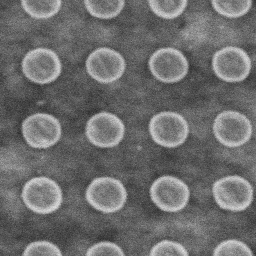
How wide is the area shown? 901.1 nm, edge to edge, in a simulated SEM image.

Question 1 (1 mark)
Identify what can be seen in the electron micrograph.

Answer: a regular array of raised bodies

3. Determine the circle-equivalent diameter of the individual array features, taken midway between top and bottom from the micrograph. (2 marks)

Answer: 127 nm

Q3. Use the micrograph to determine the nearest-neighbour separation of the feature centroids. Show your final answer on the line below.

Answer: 224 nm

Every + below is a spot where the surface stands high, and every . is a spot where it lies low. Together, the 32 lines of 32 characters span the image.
...++++....++++....++++....++++.
...++++....++++....++++....++++.
................................
................................
................................
................................
....++......++......++.....+++..
...++++....++++....++++....++++.
...++++....++++....++++....++++.
...++++....++++....++++....++++.
................................
................................
................................
................................
....++......++......++.....++++.
...++++....++++....++++....++++.
...+++++...++++....++++....++++.
...++++....++++....++++....++++.
................................
................................
................................
................................
....++......++......++......++..
...++++....++++....++++....++++.
...+++++...+++++...++++....++++.
...++++....++++.....+++....++++.
.....+..........................
................................
................................
................................
....++......++......++......++..
...++++....++++....++++....++++.